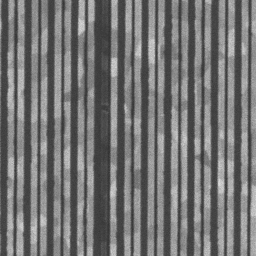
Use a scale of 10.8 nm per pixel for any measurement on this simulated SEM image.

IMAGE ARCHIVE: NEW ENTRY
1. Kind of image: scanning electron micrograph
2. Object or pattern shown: parallel lines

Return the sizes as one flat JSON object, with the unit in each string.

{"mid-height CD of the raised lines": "0.0622 µm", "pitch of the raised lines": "127 nm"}